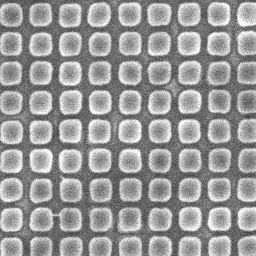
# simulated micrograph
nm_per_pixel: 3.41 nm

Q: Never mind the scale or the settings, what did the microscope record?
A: a regular array of raised bodies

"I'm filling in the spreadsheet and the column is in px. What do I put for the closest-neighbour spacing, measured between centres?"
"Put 29.1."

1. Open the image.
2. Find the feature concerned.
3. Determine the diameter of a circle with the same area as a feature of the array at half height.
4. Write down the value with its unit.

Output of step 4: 82.2 nm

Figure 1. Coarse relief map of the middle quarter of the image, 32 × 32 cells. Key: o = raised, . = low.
oooo...ooooo..ooooo..oooooo..ooo
oooo..ooooo...ooooo..oooooo..ooo
oooo..oooooo..ooooo..oooooo..ooo
oooo...ooooo..ooooo..ooooo...ooo
oooo...oooo...ooooo...oooo...ooo
................................
................................
oooo...oooo...ooooo...oooo...ooo
ooooo..ooooo..ooooo..oooooo..ooo
oooo...ooooo..ooooo..oooooo..ooo
oooo...ooooo..ooooo..ooooo...ooo
oooo...ooooo..ooooo..ooooo...ooo
................................
................................
oooo...oooo....oooo...oooo...ooo
oooo..oooooo..ooooo..oooooo..ooo
oooo..oooooo..ooooo..ooooo...ooo
oooo..ooooo...ooooo..ooooo...ooo
oooo..ooooo...ooooo...oooo...ooo
.oo....oooo....oo.....oo......oo
................................
......................oooo....oo
oooo..oooooo..ooooo...ooooo..ooo
oooo...ooooo..ooooo..oooooo..ooo
oooo..oooooo..ooooo..oooooo..ooo
oooo..oooooo..ooooo..ooooo...ooo
oooo...oooo...ooooo...oooo...ooo
................................
................................
oooo...ooooo..ooooo...oooo...ooo
oooo...ooooo..ooooo..oooooo..ooo
oooo...ooooo..ooooo..oooooo..ooo